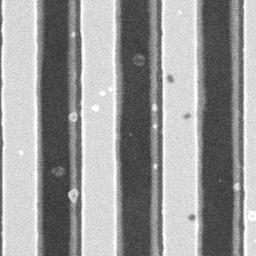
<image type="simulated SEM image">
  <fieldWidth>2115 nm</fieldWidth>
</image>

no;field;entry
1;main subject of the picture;lines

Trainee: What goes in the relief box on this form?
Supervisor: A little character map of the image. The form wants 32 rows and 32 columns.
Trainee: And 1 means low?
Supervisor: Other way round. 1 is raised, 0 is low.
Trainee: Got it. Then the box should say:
11111000001111000000111100000011
11111000001111000000111100000001
11111000001111000000111100000001
11111000001111000000111100000001
11111000001111000000111110000001
11111000001111000000111110000001
11111000001111000000111100000011
11111000001111000000111100000001
11111000001111000000111110000001
11111000001111000000111110000001
11110000001111000000111110000001
11110000001111000000111110000001
11111000001111000000111110000001
11111000001111000000111110000001
11111000001111000000111110000001
11111000001111000000111110000001
11111000001111000000111110000001
11111000001111000000111110000001
11111000001111000000111110000001
11111000001111000000111110000001
11111000001111000000111110000001
11111000001111000000111110000011
11111000001111000000111110000001
11111000001111000000111110000001
11111000001111000000111110000001
11111000001111000000111110000001
11111000001111000000111110000001
11111000001111000000111110000001
11111000001111000000111110000001
11111000001111000000111110000001
11111000001111000000111110000001
11111000001111000000111110000001